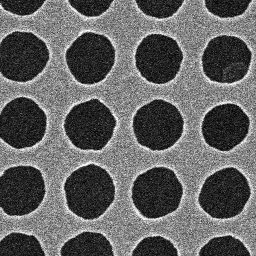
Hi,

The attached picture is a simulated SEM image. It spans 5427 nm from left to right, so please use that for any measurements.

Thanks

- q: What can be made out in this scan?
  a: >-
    a regular array of holes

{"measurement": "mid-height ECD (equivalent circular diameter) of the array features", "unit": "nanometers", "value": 1080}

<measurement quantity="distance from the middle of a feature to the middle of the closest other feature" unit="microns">1.42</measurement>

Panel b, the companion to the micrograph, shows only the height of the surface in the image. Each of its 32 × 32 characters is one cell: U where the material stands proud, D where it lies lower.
DDDDDUUUUDDDDDUUUDDDDDDUUUDDDDDU
UDDDUUUUUUDDDUUUUUDDDDUUUUDDDDDU
UUUUUUUUUUUUUUUUUUUUUUUUUUUUUUUU
UUUUUUUUUUUUUUUUUUUUUUUUUUUUUUUU
UDDDDUUUUUDDDUUUUUDDDUUUUUUDDUUU
DDDDDDUUUDDDDDUUUDDDDDUUUUDDDDDU
DDDDDDUUDDDDDDUUUDDDDDDUUDDDDDDU
DDDDDDUUDDDDDDUUUDDDDDDUUDDDDDDU
DDDDDDUUUDDDDDUUUDDDDDUUUDDDDDDU
DDDDDUUUUDDDDUUUUUDDDDUUUUDDDDDU
UUUUUUUUUUDDUUUUUUUDUUUUUUUUUUUU
UUUUUUUUUUUUUUUUUUUUUUUUUUUUUUUU
UUDDUUUUUUUDUUUUUUUDUUUUUUUUUUUU
DDDDDUUUUDDDDDUUUDDDDDUUUUUDDDUU
DDDDDDUUDDDDDDUUUDDDDDDUUUDDDDDU
DDDDDDUUDDDDDDUUUDDDDDDUUDDDDDDU
DDDDDDUUDDDDDDUUUDDDDDDUUDDDDDDU
DDDDDUUUUDDDDDUUUDDDDDUUUUDDDDUU
UUDDUUUUUUDDDUUUUUDDDUUUUUUDDUUU
UUUUUUUUUUUUUUUUUUUUUUUUUUUUUUUU
UUUUUUUUUUUUUUUUUUUUUUUUUUUUUUUU
DDDDDUUUUDDDDUUUUUDDDDUUUUUDDDUU
DDDDDUUUDDDDDDUUUDDDDDUUUUDDDDDU
DDDDDDUUDDDDDDUUDDDDDDDUUDDDDDDU
DDDDDDUUDDDDDDUUDDDDDDDUUDDDDDDU
DDDDDUUUDDDDDDUUUDDDDDUUUDDDDDDU
UDDDUUUUUDDDDUUUUDDDDDUUUUDDDDUU
UUUUUUUUUUUUUUUUUUUUUUUUUUUUUUUU
UUUUUUUUUUUUUUUUUUUUUUUUUUUUUUUU
UDDDUUUUUDDDDUUUUUUDUUUUUUUUDUUU
DDDDDUUUDDDDDDUUUDDDDDUUUUDDDDUU
DDDDDUUDDDDDDDUUUDDDDDUUUDDDDDDU